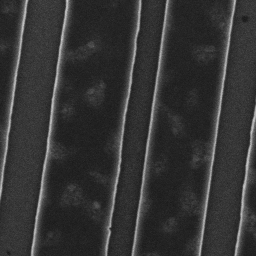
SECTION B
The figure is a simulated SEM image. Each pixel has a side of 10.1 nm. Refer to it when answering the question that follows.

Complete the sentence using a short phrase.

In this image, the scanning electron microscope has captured one or a few lines or trenches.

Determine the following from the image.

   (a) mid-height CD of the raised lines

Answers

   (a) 701 nm